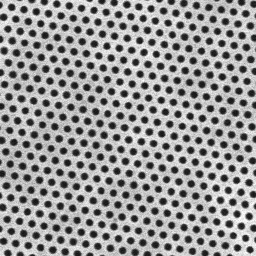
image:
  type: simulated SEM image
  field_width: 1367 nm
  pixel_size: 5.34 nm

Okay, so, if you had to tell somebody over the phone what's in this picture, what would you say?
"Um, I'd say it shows a regular array of holes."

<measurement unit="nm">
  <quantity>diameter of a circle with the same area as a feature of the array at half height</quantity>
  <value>38.6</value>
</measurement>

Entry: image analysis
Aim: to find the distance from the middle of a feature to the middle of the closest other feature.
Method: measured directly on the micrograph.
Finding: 0.066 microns